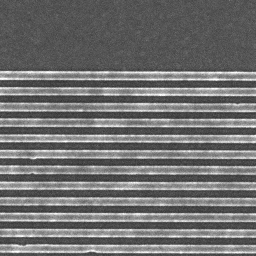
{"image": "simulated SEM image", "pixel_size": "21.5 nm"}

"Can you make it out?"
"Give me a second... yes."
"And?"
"parallel lines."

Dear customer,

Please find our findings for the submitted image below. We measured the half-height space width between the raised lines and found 183 nanometres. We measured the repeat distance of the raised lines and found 338 nm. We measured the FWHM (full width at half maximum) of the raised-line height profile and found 164 nm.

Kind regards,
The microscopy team